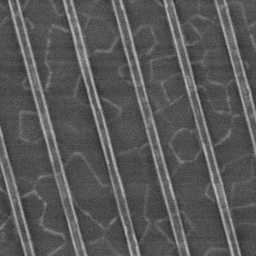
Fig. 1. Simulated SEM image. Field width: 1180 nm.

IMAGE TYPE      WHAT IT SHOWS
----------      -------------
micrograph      parallel lines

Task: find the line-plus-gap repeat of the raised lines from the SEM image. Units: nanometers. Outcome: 231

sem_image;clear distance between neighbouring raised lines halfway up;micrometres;0.187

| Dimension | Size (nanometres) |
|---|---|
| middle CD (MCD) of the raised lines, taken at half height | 42.9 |